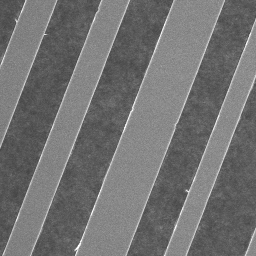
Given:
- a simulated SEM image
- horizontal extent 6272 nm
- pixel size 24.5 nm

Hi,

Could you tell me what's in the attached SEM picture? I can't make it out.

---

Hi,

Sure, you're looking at one or a few lines or trenches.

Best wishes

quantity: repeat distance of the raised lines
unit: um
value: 1.8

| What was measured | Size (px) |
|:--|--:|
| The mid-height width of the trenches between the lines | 40.7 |